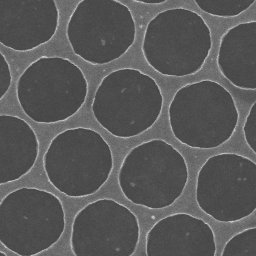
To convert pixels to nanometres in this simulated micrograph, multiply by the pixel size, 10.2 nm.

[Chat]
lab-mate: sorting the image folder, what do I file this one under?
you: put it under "holes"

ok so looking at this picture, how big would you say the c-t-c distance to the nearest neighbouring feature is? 778 nanometers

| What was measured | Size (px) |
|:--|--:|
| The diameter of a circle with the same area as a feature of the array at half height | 66.9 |